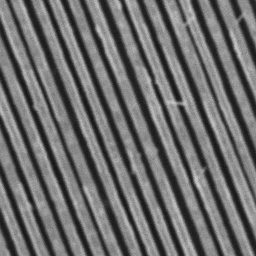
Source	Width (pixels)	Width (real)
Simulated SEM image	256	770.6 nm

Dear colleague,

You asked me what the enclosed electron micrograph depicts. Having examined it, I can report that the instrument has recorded parallel lines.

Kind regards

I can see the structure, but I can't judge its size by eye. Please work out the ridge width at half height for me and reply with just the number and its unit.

9.53 pixels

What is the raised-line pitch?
0.0523 um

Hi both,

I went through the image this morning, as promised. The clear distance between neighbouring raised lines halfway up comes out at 23.5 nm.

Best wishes